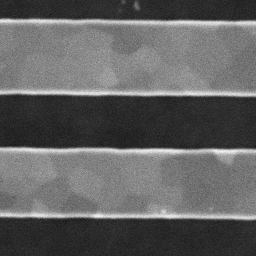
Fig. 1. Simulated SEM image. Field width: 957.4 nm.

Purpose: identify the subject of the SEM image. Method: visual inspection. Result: wiring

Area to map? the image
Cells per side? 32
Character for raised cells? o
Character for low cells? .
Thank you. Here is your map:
................................
................................
oo.oo...........................
oooooooooooooooooooooooooooooooo
oooooooooooooooooooooooooooooooo
oooooooooooooooooooooooooooooooo
oooooooooooooooooooooooooooooooo
oooooooooooooooooooooooooooooooo
oooooooooooooooooooooooooooooooo
oooooooooooooooooooooooooooooooo
oooooooooooooooooooooooooooooooo
oooooooooooooooooooooooooooooooo
................................
................................
................................
................................
................................
................................
................................
oooooooooooooooooooooooooooooooo
oooooooooooooooooooooooooooooooo
oooooooooooooooooooooooooooooooo
oooooooooooooooooooooooooooooooo
oooooooooooooooooooooooooooooooo
oooooooooooooooooooooooooooooooo
oooooooooooooooooooooooooooooooo
oooooooooooooooooooooooooooooooo
................................
................................
................................
................................
................................